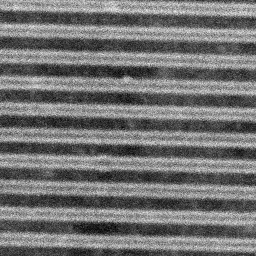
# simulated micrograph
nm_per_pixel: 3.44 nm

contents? parallel lines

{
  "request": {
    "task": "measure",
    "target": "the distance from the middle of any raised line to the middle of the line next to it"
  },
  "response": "89.9 nanometers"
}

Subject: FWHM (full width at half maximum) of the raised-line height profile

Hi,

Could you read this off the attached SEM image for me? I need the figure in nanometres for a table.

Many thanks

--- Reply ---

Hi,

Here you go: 37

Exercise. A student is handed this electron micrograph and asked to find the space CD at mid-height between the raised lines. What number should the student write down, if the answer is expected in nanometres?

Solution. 52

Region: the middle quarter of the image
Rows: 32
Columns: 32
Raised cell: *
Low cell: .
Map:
............................**..
................................
................................
...............*................
********************************
********************************
.......***..*.******************
................................
................................
................................
******..........................
********************************
********************************
............................****
................................
................................
................................
********************************
********************************
.........***********************
................................
................................
................................
*************...................
********************************
********************************
.........................***...*
................................
................................
................................
******************************..
********************************